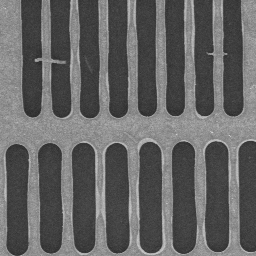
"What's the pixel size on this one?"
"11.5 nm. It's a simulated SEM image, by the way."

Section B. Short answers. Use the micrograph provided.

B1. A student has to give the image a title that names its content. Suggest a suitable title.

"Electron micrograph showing groups of lines, slits or small figures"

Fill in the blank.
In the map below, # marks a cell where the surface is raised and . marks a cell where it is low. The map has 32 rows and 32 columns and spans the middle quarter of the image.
..##.....##.....##.....##.....##
..##.....##.....##.....##.....##
..##.....##.....##.....##.....##
..##.....##.....##.....##.....##
..##.....##.....##.....##.....##
..##.....##.....##.....##.....##
..##.....##.....##......#.....##
..##.....##.....##......#......#
..##.....##.....##......#......#
..##.....##.....##......#......#
..##.....##.....##......#.....##
..##.....##.....##.....###....##
..##.....###....###....###....##
#####...#####.##################
################################
################################
################################
################################
################################
####################...######..#
###....####....####.....####....
##......##......###.....###.....
##......##......###......##.....
##......##......###......##.....
##......##......###......##.....
##......##......###......##.....
##......##......###......##.....
##......##......###......##.....
##......##......##.......##.....
##......##......##.......##.....
##......##.......#.......##.....
##......##.......#.......##.....